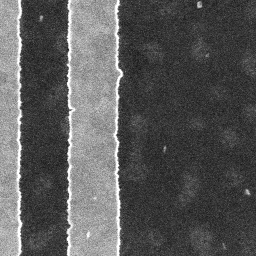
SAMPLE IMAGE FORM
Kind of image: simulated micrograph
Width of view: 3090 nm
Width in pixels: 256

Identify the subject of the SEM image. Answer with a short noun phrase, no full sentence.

one or a few lines or trenches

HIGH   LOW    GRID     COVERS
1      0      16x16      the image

1000111000000000
1000111000000000
1000111000000000
1000111000000000
1000111100000000
1000111000000000
1000111000000000
1000111000000000
1000111000000000
1000111000000000
1000111000000000
1000111000000000
1000111000000000
1000111000000000
1000111000000000
1000111000000000